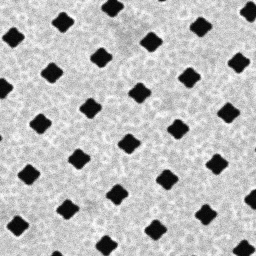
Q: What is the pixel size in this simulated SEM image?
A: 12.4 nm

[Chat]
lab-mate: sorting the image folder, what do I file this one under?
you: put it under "a regular array of holes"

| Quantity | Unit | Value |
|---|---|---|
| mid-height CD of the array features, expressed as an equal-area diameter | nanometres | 248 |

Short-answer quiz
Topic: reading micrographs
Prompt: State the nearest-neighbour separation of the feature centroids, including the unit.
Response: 637 nm